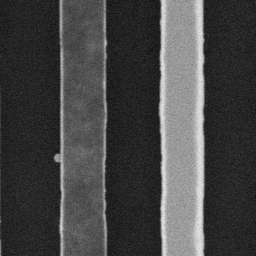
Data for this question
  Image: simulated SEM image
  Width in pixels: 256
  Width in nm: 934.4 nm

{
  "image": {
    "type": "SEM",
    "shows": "lines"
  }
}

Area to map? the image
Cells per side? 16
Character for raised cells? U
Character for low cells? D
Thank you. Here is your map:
DDDDUUUDDDUUUDDD
DDDDUUUDDDUUUDDD
DDDDUUUDDDUUUDDD
DDDDUUUDDDUUUDDD
DDDDUUUDDDUUUDDD
DDDDUUUDDDUUUDDD
DDDDUUUDDDUUUDDD
DDDDUUUDDDUUUDDD
DDDDUUUDDDUUUDDD
DDDDUUUDDDUUUDDD
DDDDUUUDDDUUUDDD
DDDDUUUDDDUUUDDD
DDDDUUUDDDUUUDDD
DDDDUUUDDDUUUDDD
DDDDUUUDDDUUUDDD
DDDDUUUDDDUUUDDD